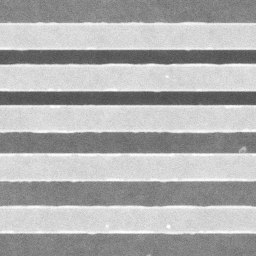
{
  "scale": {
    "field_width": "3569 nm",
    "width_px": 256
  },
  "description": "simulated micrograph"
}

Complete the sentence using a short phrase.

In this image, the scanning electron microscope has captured lines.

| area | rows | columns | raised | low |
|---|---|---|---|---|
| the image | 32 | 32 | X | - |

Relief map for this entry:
--------------------------------
--------------------------------
--------------------------------
XXXXXXXXXXXXXXXXXXXXXXXXXXXXXXXX
XXXXXXXXXXXXXXXXXXXXXXXXXXXXXXXX
XXXXXXXXXXXXXXXXXXXXXXXXXXXXXXXX
--------------------------------
--------------------------------
XXXXXXXXXXXXXXXXXXXXXXXXXXXXXXXX
XXXXXXXXXXXXXXXXXXXXXXXXXXXXXXXX
XXXXXXXXXXXXXXXXXXXXXXXXXXXXXXXX
--------------------------------
--------------------------------
XXXXXXXXXXXXXXXXXXXXXXXXXXXXXXXX
XXXXXXXXXXXXXXXXXXXXXXXXXXXXXXXX
XXXXXXXXXXXXXXXXXXXXXXXXXXXXXXXX
X---XXXXXX--X---X----XXXXXXXX---
--------------------------------
--------------------------------
XXXXXXXXXXXXXXXXXXXXXXXXXXXXXXXX
XXXXXXXXXXXXXXXXXXXXXXXXXXXXXXXX
XXXXXXXXXXXXXXXXXXXXXXXXXXXXXXXX
XXXXXXXXXXXXXXXXXXXXXXXXXXXXXXXX
--------------------------------
--------------------------------
--------------------------------
XXXXXXXXXXXXXXXXXXXXXXXXXXXXXXXX
XXXXXXXXXXXXXXXXXXXXXXXXXXXXXXXX
XXXXXXXXXXXXXXXXXXXXXXXXXXXXXXXX
--------------------------------
--------------------------------
--------------------------------